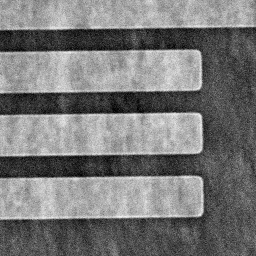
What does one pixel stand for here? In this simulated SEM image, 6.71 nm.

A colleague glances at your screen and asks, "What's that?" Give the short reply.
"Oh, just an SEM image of groups of lines, slits or small figures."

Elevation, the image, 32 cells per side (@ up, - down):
@@@@@@@@@@@@@@@@@@@@@@@@@@@@@@@@
@@@@@@@@@@@@@@@@@@@@@@@@@@@@@@@@
@@@@@@@@@@@@@@@@@@@@@@@@@@@@@@@@
@@@@@@@@@-----------------------
--------------------------------
--------------------------------
-------@@@@@@@@@@@@@@@@@@-------
@@@@@@@@@@@@@@@@@@@@@@@@@-------
@@@@@@@@@@@@@@@@@@@@@@@@@-------
@@@@@@@@@@@@@@@@@@@@@@@@@-------
@@@@@@@@@@@@@@@@@@@@@@@@@-------
@@------------------------------
--------------------------------
--------------------------------
@@@@@@@@@@@@@@@@@@@@@@@@@-------
@@@@@@@@@@@@@@@@@@@@@@@@@-------
@@@@@@@@@@@@@@@@@@@@@@@@@-------
@@@@@@@@@@@@@@@@@@@@@@@@@-------
@@@@@@@@@@@@@@@@@@@@@@@@@-------
--------------------------------
--------------------------------
--------------------------------
@@@@@@@@@@@@@@@@@@@@@@@@@-------
@@@@@@@@@@@@@@@@@@@@@@@@@-------
@@@@@@@@@@@@@@@@@@@@@@@@@-------
@@@@@@@@@@@@@@@@@@@@@@@@@-------
@@@@@@@@@@@@@@@@@@@@@@@@@-------
--------------------------------
--------------------------------
--------------------------------
--------------------------------
--------------------------------